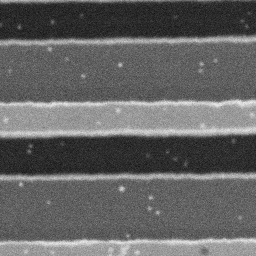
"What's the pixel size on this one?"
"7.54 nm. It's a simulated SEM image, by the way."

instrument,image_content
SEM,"lines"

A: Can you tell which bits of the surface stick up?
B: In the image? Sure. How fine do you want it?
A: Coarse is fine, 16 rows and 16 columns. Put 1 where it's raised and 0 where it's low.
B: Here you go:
0000000000000000
0000000000000000
0000000000000000
1111111111111111
1111111111111111
1111111111111111
1111111111111111
1111111111111111
0000000000000000
0000000000000000
0000000000000000
1111111111111111
1111111111111111
1111111111111111
1111111111111111
1111111111111111